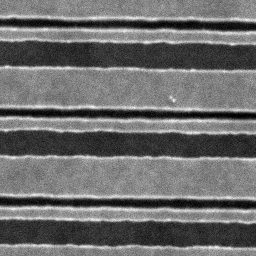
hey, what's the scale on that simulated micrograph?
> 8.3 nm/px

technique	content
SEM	lines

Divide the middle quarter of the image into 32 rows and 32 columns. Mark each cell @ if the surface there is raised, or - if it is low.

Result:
--------------------------------
@@@@@@@@@@@@@@@@@@@@@-----------
@@@@@@@@@@@@@@@@@@@@@@@@@@@@@@@@
@@@@@@@@@@@@@@@@@@@@@@@@@@@@@@@@
@@@@@@@@@@@@@@@@@@@@@@@@@@@@@@@@
@@@@@@@@@@@@@@@@@@@@@@@@@@@@@@@@
@@@@@@@@@@@@@@@@@@@@@@@@@@@@@@@@
@@@@@@@@@@@@@@@@@@@@@@@@@@@@@@@@
@@@@@@@@@@@@@@@@@@@@@@@@@@@@@@@@
@@@@@@@@@@@@@@@@@@@@@@@@@@@@@@@@
@@@@@@@@@@@@@@@@@@@@@@@@@@@@@@@@
--------------------------------
--------------------------------
--------------------------------
@@@@@@@@@@@@@@@@@@@@@@@@@@@@@@@@
@@@@@@@@@@@@@@@@@@@@@@@@@@@@@@@@
@@@@@@@@---@@@@@@@@@@@@@@@@@@@@@
--------------------------------
--------------------------------
--------------------------------
--------------------------------
--------------------------------
--------------------------------
@@@@@@@@@@@@@@@@@@@@@@@@@@@@----
@@@@@@@@@@@@@@@@@@@@@@@@@@@@@@@@
@@@@@@@@@@@@@@@@@@@@@@@@@@@@@@@@
@@@@@@@@@@@@@@@@@@@@@@@@@@@@@@@@
@@@@@@@@@@@@@@@@@@@@@@@@@@@@@@@@
@@@@@@@@@@@@@@@@@@@@@@@@@@@@@@@@
@@@@@@@@@@@@@@@@@@@@@@@@@@@@@@@@
@@@@@@@@@@@@@@@@@@@@@@@@@@@@@@@@
@@@@@@@@@@@@@@@@@@@@@@@@@@@@@@@@